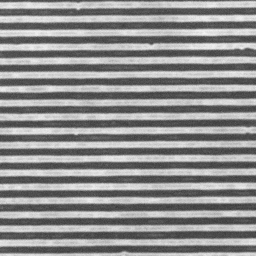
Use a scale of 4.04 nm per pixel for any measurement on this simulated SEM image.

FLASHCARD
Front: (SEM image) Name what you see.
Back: parallel lines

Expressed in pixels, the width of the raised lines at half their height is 5.12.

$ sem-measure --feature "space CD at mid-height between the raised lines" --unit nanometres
34.9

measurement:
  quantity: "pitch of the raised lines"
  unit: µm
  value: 0.0565